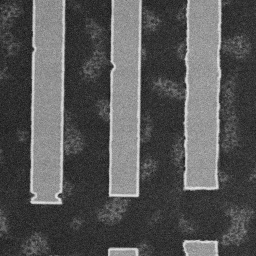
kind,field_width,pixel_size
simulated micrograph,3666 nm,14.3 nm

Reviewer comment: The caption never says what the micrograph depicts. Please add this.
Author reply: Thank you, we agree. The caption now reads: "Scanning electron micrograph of one or a few lines or trenches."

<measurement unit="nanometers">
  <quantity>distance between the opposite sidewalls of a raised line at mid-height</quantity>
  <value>428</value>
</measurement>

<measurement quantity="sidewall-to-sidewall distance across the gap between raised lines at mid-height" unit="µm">0.682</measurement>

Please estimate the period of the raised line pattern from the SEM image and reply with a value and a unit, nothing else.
1110 nm